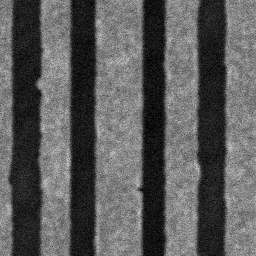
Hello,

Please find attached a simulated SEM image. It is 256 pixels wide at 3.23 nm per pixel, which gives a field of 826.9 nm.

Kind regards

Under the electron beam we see one or a few lines or trenches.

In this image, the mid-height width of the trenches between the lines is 27.5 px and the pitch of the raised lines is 203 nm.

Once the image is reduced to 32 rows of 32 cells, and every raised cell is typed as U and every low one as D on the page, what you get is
UUDDDUUUUDDDUUUUUUDDDUUUUDDDUUUU
UDDDDUUUUDDDUUUUUUDDDUUUUDDDUUUU
UDDDDUUUUDDDUUUUUUDDDUUUUDDDUUUU
UDDDDUUUUDDDUUUUUUDDDUUUUDDDUUUU
UDDDDUUUUDDDUUUUUUDDDUUUUDDDUUUU
UDDDDUUUUDDDUUUUUUDDDUUUUDDDUUUU
UDDDDUUUUDDDUUUUUUDDDUUUUDDDUUUU
UDDDDUUUUDDDUUUUUUDDDUUUUDDDUUUU
UDDDDUUUUDDDUUUUUUDDDUUUUDDDUUUU
UDDDDUUUUDDDUUUUUUDDDUUUUDDDUUUU
UDDDDUUUUDDDUUUUUUDDDUUUUDDDUUUU
UDDDDUUUUDDDUUUUUUDDDUUUUDDDUUUU
UDDDDUUUUDDDUUUUUUDDDUUUUDDDUUUU
UDDDDUUUUDDDUUUUUUDDDUUUUDDDUUUU
UDDDDUUUUDDDUUUUUUDDDUUUUDDDUUUU
UDDDDUUUUDDDUUUUUUDDDUUUUDDDUUUU
UDDDDUUUUDDDUUUUUUDDDUUUUDDDUUUU
UDDDDUUUUDDDUUUUUUDDDUUUUDDDUUUU
UDDDDUUUUDDDUUUUUUDDDUUUUDDDUUUU
UDDDDUUUUDDDUUUUUUDDDUUUUDDDUUUU
UDDDDUUUUDDDUUUUUUDDDUUUUDDDUUUU
UDDDDUUUUDDDUUUUUUDDDUUUUDDDUUUU
UDDDDUUUUDDDUUUUUUDDDUUUUDDDUUUU
UDDDDUUUUDDDUUUUUDDDDUUUUDDDUUUU
UDDDDUUUUDDDUUUUUUDDDUUUUDDDUUUU
UDDDDUUUUDDDUUUUUUDDDUUUUDDDUUUU
UDDDDUUUUDDDUUUUUUDDDUUUUDDDUUUU
UDDDDUUUUDDDUUUUUUDDDUUUUDDDUUUU
UDDDDUUUUDDDUUUUUUDDDUUUUDDDUUUU
UDDDDUUUUDDDUUUUUUDDDUUUUDDDUUUU
UDDDDUUUUDDDUUUUUUDDDUUUUDDDUUUU
UDDDDUUUUDDDUUUUUUDDDUUUUDDDUUUU